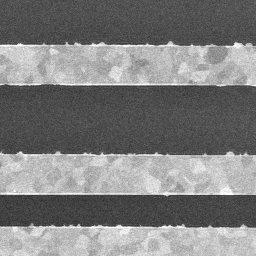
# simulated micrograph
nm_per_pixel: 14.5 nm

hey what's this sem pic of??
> lines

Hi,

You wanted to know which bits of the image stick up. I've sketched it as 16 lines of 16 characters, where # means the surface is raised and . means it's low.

................
................
................
################
################
................
................
................
................
................
################
################
................
................
################
################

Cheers